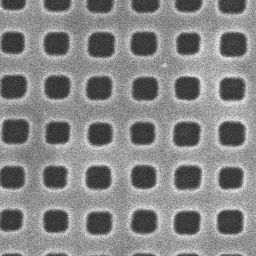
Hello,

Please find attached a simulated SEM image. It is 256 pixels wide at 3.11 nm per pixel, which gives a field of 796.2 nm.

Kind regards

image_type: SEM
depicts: a regular array of holes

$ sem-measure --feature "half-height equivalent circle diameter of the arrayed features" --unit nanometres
87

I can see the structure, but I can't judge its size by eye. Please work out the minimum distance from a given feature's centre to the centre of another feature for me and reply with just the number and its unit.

133 nm